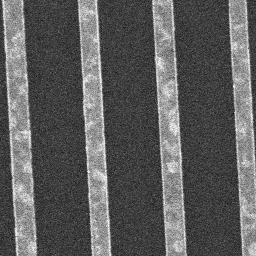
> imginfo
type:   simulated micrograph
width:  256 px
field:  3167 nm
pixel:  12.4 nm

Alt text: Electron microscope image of one or a few lines or trenches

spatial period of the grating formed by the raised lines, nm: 925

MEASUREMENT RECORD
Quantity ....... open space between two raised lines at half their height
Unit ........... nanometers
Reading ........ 705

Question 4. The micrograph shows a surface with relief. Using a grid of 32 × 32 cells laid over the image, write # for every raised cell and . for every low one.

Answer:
###.......##.......###.......##.
###.......##.......###.......##.
.##.......##.......###.......##.
.##.......##.......###.......##.
.##.......##.......###.......##.
.##.......##.......###.......##.
.##.......##........##.......##.
.##.......##........##.......##.
.##.......##........##.......##.
.##.......###.......##.......##.
.##........##.......##.......##.
.##........##.......##.......##.
.##........##.......##.......##.
.##........##.......##.......##.
.###.......##.......##........#.
.###.......##.......##........#.
.###.......##.......##........##
.###.......##.......##........##
.###.......##.......###.......##
.###.......##.......###.......##
..##.......##.......###.......##
..##.......##.......###.......##
..##.......##.......###.......##
..##.......##.......###.......##
..##.......##........##.......##
..##.......##........##.......##
..##.......##........##.......##
..##.......##........##.......##
..##.......###.......##.......##
..##........##.......##.......##
..##........##.......##.......##
..##........##.......##.......##